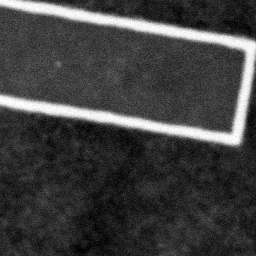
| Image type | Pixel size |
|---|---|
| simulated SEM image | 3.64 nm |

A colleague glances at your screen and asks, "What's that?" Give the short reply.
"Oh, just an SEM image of one or a few lines or trenches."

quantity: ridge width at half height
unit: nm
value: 356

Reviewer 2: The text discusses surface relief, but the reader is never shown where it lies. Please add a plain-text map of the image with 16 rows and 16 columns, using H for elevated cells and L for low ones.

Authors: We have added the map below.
HHHLLLLLLLLLLLLL
HHHHHHHHLLLLLLLL
HHHHHHHHHHHHHHLL
HHHHHHHHHHHHHHHH
HHHHHHHHHHHHHHHH
HHHHHHHHHHHHHHHL
LHHHHHHHHHHHHHHL
LLLLLLLHHHHHHHHL
LLLLLLLLLLLLLHHL
LLLLLLLLLLLLLLLL
LLLLLLLLLLLLLLLL
LLLLLLLLLLLLLLLL
LLLLLLLLLLLLLLLL
LLLLLLLLLLLLLLLL
LLLLLLLLLLLLLLLL
LLLLLLLLLLLLLLLL